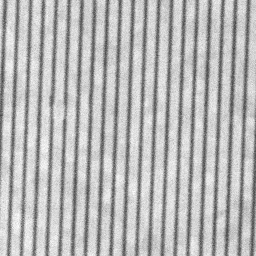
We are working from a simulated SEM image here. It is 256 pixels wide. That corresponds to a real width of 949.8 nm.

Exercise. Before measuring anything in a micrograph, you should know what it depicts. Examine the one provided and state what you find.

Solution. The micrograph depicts parallel lines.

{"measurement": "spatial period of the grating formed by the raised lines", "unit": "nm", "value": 47.5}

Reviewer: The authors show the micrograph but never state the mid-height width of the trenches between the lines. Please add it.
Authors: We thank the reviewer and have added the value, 19 nm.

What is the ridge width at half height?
28.7 nm